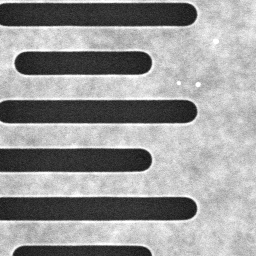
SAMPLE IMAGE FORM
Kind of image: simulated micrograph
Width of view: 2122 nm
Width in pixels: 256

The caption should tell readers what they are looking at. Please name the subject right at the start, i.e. groups of lines, slits or small figures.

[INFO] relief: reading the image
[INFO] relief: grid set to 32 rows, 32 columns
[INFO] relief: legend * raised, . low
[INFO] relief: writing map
........................********
.........................*******
........................********
********************************
********************************
********************************
***...............**************
**.................*************
**.................*************
********************************
********************************
********************************
*......................*********
.........................*******
.........................*******
*......................*********
********************************
********************************
***********.********************
...................*************
...................*************
..................**************
********************************
********************************
************.*******************
........................********
.........................*******
.......................*********
********************************
********************************
********************************
**.................*************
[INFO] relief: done